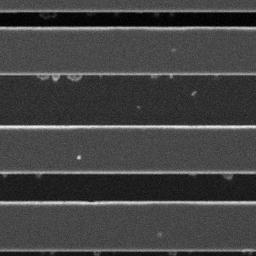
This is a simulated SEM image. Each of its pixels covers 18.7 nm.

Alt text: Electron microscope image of lines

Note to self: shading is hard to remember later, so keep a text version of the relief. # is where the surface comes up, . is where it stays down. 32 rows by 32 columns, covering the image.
################################
................................
................................
################################
################################
################################
################################
################################
################################
................................
................................
................................
................................
................................
................................
................................
################################
################################
################################
################################
################################
################################
................................
................................
................................
################################
################################
################################
################################
################################
################################
................................